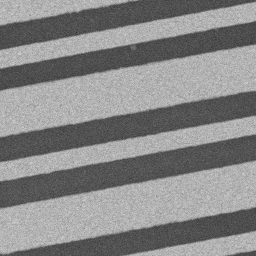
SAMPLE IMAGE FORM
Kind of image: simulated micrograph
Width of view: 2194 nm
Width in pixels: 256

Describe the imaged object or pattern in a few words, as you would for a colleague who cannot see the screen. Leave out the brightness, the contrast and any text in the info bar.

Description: lines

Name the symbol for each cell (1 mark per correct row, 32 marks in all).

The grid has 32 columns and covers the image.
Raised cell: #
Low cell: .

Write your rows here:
###############...............##
#########.................######
####................############
...............############.....
.........#############..........
....#############...............
###########...............######
######...............###########
................################
..........######################
.....###########################
###############################.
#########################.......
####################............
##############..................
#########.................######
###..................###########
................############....
..........#############.........
.....############...............
############..................##
######...................#######
#..................#############
..............##################
.........#######################
...#############################
#############################...
#######################.........
##################..............
############.................###
#######.................########
##................############..